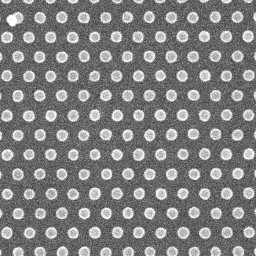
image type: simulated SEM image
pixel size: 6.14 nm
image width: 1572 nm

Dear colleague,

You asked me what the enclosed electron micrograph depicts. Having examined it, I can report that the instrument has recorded a regular array of raised bodies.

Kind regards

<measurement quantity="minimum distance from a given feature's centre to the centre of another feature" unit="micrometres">0.134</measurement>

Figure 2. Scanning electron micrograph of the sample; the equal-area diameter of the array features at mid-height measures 63.5 nm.